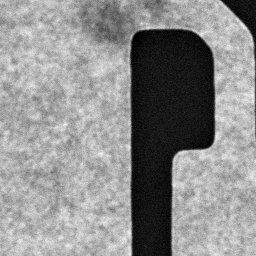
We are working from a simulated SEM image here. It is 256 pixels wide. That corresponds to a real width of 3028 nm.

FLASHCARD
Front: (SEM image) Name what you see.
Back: wiring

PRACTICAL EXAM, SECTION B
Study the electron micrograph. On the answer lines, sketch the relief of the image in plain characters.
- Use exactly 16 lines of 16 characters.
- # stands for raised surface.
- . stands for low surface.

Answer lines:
##############..
###############.
########.....###
########.....###
########.....###
########.....###
########.....###
########.....###
########.....###
########...#####
########...#####
########...#####
########...#####
########...#####
########...#####
########...#####